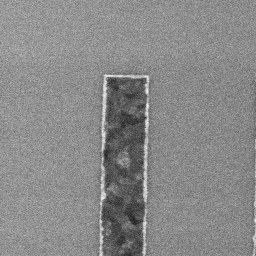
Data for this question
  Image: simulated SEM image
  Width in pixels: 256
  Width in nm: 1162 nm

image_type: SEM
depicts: one or a few lines or trenches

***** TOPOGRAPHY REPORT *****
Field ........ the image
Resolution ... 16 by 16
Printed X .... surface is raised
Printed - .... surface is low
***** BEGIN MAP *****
----------------
----------------
----------------
----------------
----------------
------XXX-------
------XXX-------
------XXX-------
------XXX-------
------XXX-------
------XXX-------
------XXX-------
------XXX-------
------XXX-------
------XXX-------
------XXX-------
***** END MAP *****